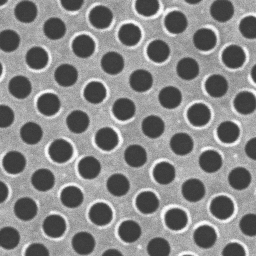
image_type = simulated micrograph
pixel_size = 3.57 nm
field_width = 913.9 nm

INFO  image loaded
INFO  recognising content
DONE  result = a regular array of holes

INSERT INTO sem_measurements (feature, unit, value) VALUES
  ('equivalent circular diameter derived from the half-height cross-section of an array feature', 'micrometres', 0.0805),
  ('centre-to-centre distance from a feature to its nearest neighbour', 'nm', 120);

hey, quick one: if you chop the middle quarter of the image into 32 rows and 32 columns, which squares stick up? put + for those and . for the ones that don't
..+++++++......+++++++++++++....
...+++++++.....+++..++++++++....
...++++++++..++++.....+++++++...
...+++++++++++++......+++++++...
...++++..+++++++......++++++++++
.++++.....+++++++.....++++++++++
+++++......+++++++...+++.....+++
+++++......+++++++++++++.....+++
+++++.....++++++++++++++.....+++
++++++...++++....+++++++.....+++
++++++++++++......+++++++...++++
++++++++++++......+++++++++++++.
+.....++++++......+++++++++++++.
+.....+++++++....+++....+++++++.
+.....++++++++++++++.....+++++++
+.....+++++++++++++......+++++++
++...++++...++++++++.....+++++++
++++++++.....+++++++....++++...+
++++++++.....+++++++++.++++.....
.+++++++.....++++++++++++++.....
..+++++++....+++...++++++++.....
..++++++++..+++.....+++++++.....
..+++++++++++++......+++++++...+
.++++...+++++++......+++++++++++
++++.....++++++.....++++++++++++
++++.....++++++++...+++....+++++
++++.....+++++++++++++......++++
++++.....++++.++++++++......++++
+++++...+++.....+++++++.....++++
+++++++++++.....+++++++....+++..
+++++++++++.....++++++++++++++..
....+++++++.....+++++++++++++...